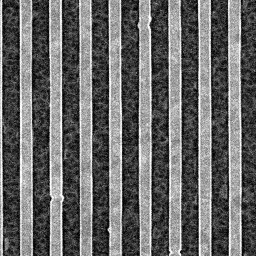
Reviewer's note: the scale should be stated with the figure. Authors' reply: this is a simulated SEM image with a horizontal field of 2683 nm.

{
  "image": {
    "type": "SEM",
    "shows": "parallel lines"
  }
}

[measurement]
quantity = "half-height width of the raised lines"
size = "11.6 pixels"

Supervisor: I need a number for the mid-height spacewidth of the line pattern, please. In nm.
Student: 196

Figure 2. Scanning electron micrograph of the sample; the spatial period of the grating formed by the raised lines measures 313 nm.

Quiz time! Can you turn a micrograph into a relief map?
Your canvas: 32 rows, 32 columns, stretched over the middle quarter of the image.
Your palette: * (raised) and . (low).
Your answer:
....***....***.....***....***...
....***....***.....***....***...
....***....***.....***....***...
....***.....**.....***....***...
....***.....**.....***....***...
....***.....**.....***....***...
....***.....**.....***....***...
....***.....**.....***....***...
....***.....**.....***....***...
....***....***.....***....***...
....***....***.....***....***...
....***....***.....***....***...
....***....***.....***....***...
....***....***.....***....***...
....***....***.....***....***...
....***....***.....***....***...
....***....***.....***....***...
....***....***.....***....***...
....***....***.....***....***...
....***....***.....***.....**...
....***....***.....***.....**...
....***....***.....***.....**...
....***....***.....***.....**...
....***....***.....***.....**...
....***....***.....***.....**...
....***....***.....***.....**...
....***....***.....***.....**...
....***....***.....***.....**...
....***....***.....***.....**...
....***....***.....**......**...
....***....***.....***.....**...
....***....***.....***.....**...